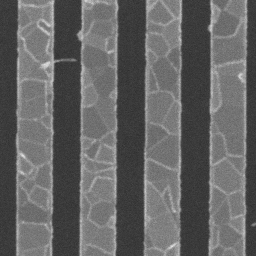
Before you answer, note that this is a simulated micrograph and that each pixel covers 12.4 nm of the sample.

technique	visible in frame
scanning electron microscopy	lines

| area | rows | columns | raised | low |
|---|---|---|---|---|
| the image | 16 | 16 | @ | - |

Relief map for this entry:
-@@--@@--@@--@@-
-@@--@@--@@--@@-
-@@--@@--@@--@@-
-@@--@@--@@--@@-
-@@--@@--@@--@@-
-@@--@@--@@--@@-
-@@--@@--@@--@@-
-@@--@@--@@--@@-
-@@--@@--@@--@@-
-@@--@@--@@--@@-
-@@--@@--@@--@@-
-@@--@@--@@--@@-
-@@--@@--@@--@@-
-@@--@@--@@--@@-
-@@--@@--@@--@@-
-@@--@@--@@--@@-